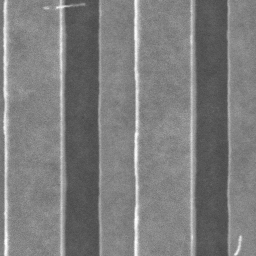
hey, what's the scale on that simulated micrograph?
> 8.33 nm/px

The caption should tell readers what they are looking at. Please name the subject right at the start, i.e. lines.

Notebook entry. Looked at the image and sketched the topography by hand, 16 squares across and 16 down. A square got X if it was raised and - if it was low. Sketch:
XXXX--XXXXXX--XX
XXXX--XXXXXX--XX
XXXX--XXXXXX--XX
XXXX--XXXXXX--XX
XXXX--XXXXXX--XX
XXXX--XXXXXX--XX
XXXX--XXXXXX--XX
XXXX--XXXXXX--XX
XXXX--XXXXXX--XX
XXXX--XXXXXX--XX
XXXX--XXXXXX--XX
XXXX--XXXXXX--XX
XXXX--XXXXXX--XX
XXXX--XXXXXX--XX
XXXX--XXXXXX--XX
XXXX--XXXXXX--XX